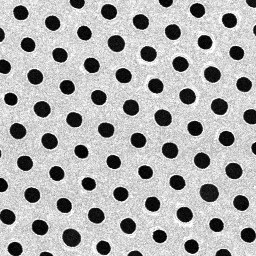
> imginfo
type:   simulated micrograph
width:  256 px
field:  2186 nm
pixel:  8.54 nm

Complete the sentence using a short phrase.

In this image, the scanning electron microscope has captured a regular array of holes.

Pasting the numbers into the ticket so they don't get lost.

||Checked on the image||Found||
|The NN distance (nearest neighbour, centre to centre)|0.28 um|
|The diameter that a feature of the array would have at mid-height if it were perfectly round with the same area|134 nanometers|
